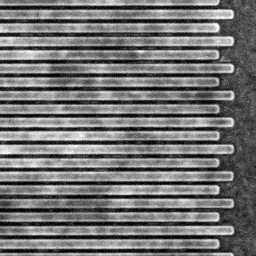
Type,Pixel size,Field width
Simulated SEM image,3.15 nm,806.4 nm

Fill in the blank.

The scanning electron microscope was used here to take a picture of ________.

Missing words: parallel lines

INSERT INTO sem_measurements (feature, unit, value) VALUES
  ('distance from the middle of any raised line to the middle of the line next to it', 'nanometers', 42.5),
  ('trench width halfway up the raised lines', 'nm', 18.5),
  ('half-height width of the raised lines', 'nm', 24.8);